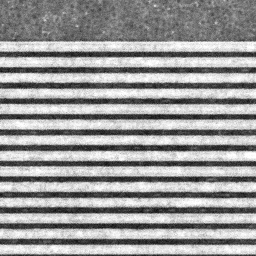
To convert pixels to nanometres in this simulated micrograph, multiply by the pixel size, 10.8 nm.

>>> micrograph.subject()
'parallel lines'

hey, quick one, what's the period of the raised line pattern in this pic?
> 15.6 pixels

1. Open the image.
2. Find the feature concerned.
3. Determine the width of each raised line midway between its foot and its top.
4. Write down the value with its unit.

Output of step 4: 93.4 nanometres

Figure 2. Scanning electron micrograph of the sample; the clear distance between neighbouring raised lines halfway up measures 73.1 nm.